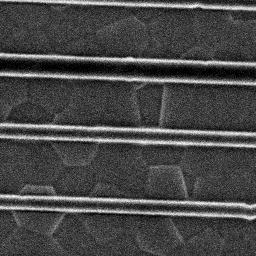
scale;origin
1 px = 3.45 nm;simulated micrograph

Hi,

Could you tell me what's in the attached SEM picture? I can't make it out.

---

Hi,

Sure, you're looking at one or a few lines or trenches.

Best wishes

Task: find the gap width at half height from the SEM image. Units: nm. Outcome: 186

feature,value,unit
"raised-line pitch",237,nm